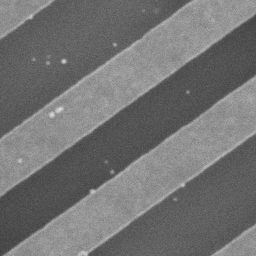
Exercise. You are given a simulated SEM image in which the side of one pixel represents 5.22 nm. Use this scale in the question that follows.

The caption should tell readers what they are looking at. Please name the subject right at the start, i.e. lines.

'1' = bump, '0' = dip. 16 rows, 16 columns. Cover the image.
1110000000011111
1000000000111110
0000000001111100
0000000111110000
0000001111100000
0000111110000001
0001111100000111
0011111000001111
1111100000011111
1111000001111100
1110000011111000
1000000111110000
0000011111000000
0000111110000000
0011111000000001
0111110000000011